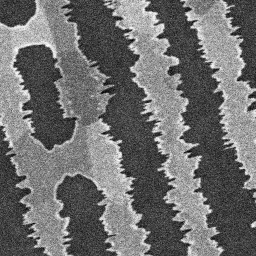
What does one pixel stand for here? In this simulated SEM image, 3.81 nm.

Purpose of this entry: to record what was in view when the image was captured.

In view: one or a few lines or trenches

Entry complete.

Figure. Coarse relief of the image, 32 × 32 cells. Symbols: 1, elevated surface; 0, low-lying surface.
00000111000000111100000111110000
00000111000000111110000011110000
00001111100000011110000011111000
11111111110000011111000011111000
11111111110000001111000001111000
11110011110000000111100001111100
11000001110000000111100000111100
11000001111000000111110000111100
11000001111100000111100000011100
11000000111110000111110000011100
11100001111110000111110000011110
11100001111110000011110000001110
11100001111111000001111000001110
11100000111110000011111000001110
11100000111110000001111000001111
11110000001110000000111000001111
01110000011110000000111000001111
01110000011111000000111000001111
01111101111111100000111100000111
00111111111111100000011100000011
00111111111111100000011110000011
00111111111111100000011100000001
00011111000011110000001110000001
00011110000011110000001110000001
00011110000001110000011110000000
00011111000001110000001111000000
00011110000001111000001111000000
00011111000001111000001111000000
00001111000001111000000111100000
00001111000000111100000111100000
00000111000000111100000011100000
00000011000000011100000011110000